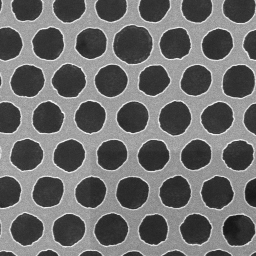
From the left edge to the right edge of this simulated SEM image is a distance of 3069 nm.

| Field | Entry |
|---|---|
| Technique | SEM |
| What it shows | a regular array of holes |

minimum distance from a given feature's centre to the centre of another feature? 0.502 um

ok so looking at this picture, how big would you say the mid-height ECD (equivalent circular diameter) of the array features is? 379 nanometers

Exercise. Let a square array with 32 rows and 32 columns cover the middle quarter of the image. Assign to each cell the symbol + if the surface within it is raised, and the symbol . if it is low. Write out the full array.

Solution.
...++++++++...++++++++..++++++++
..+.+++++......+++++.....+++++..
.....+++........+++.......++++..
.....+++........+++.......+++...
......++........+++........++...
.....+++........+++.......+++...
.....+++.......++++......+++++..
....+++++.....++++++....+++++++.
..++++++++++++++++++++++++++++++
+++++...++++++++...++++++++...++
++++.....++++++.....+++++......+
+++.......++++.......+++.......+
+++.......+++........+++........
+++.......+++........+++........
+++.......+++........+++........
+++....+..++++.......+++.......+
++++.....++++++.....+++++.....++
++++++++++++++++++++++++++...+++
++++++++++++++++++++++++++++++++
....++++++....+++++++....++++++.
.....++++......++++.......++++..
.....+++........+++.......++++..
.....+++........++........+++...
.....+++........+++.......+++...
.....+++.......++++.......+++...
....+++++.....+++++......+++++..
...++++++++..+++++++....++++++++
++++++++++++++++++++++++++++++++
++++++..+++++++....++++++++...++
++++......++++.......++++......+
+++.......+++........+++.......+
+++........++........+++........